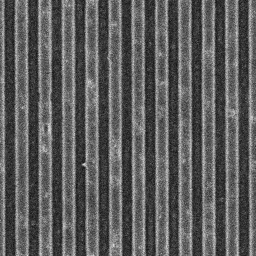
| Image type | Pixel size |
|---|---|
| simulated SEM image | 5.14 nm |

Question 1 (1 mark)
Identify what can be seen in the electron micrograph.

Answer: parallel lines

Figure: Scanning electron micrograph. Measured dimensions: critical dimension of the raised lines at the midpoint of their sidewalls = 57.8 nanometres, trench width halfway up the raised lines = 62.3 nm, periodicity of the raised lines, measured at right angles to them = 120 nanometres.